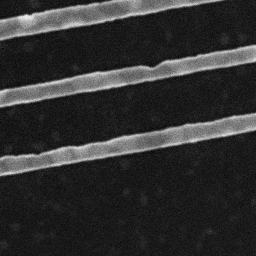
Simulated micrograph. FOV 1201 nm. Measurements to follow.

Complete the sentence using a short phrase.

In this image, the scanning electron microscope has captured one or a few lines or trenches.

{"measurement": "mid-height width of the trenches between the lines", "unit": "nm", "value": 239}